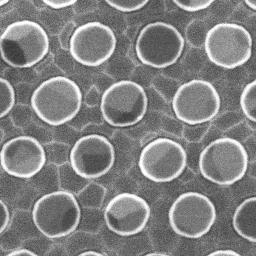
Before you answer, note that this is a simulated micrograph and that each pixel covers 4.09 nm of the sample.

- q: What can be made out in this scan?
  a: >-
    a regular array of raised bodies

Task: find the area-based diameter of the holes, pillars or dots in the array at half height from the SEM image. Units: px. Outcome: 43.7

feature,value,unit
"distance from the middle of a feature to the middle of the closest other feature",267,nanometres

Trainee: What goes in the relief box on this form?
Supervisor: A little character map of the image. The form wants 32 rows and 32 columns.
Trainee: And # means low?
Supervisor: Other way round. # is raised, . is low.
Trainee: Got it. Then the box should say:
......###.....####....####.....#
................................
................................
.####.....###.....####.....###..
######...#####...######...#####.
######...#####...######...#####.
######...#####...######...#####.
.####.....###.....####.....####.
................................
................................
#....####......##......###.....#
##..######...#####....#####....#
##..######...#####....#####...##
#...######...#####....#####...##
.....####....#####....#####....#
..............##................
................................
..##......###.......#.......#...
#####....#####....#####...####..
#####....#####....#####..######.
#####....#####....#####..######.
.####.....###.....#####..#####..
...................##.....####..
................................
......###......##......##.......
.....#####....####....####....##
#...######...######..######..###
#...######...#####...######..###
.....####.....####....####...###
......#................##.....##
................................
..##.......................##...